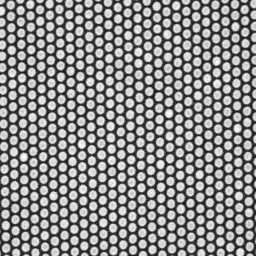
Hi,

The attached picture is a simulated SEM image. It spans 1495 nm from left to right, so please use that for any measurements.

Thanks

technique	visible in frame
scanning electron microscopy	a regular array of raised bodies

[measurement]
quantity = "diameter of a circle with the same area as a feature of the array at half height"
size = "47.5 nanometers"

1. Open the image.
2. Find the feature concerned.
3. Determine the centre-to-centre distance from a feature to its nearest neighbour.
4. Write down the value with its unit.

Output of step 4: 64.6 nm